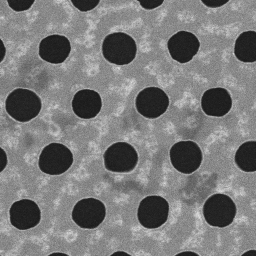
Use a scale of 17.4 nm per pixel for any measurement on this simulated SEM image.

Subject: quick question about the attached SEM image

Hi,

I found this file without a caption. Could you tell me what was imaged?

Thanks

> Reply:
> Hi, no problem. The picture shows a regular array of holes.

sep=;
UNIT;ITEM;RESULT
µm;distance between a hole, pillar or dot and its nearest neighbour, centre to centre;1.1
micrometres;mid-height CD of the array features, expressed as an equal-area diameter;0.561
